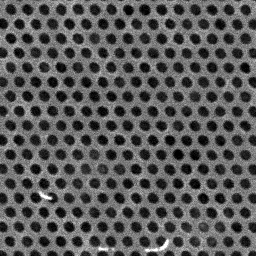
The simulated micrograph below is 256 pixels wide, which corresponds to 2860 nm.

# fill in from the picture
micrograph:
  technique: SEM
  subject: a regular array of holes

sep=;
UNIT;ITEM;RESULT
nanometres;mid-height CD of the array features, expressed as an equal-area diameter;133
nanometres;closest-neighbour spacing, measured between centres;184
